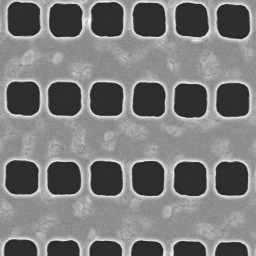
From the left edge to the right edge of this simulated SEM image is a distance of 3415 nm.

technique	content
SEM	a regular array of holes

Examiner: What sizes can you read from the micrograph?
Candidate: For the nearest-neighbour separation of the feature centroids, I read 41.9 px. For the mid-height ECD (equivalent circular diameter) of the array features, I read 482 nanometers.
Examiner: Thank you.